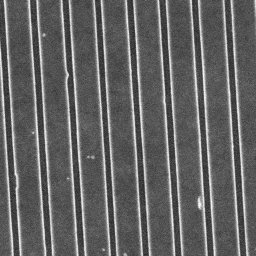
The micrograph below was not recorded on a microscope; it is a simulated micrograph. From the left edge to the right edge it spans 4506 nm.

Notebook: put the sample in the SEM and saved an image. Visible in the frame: parallel lines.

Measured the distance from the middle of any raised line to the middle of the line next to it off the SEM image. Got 568 nm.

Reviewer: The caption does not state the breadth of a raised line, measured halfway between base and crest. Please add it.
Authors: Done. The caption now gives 448 nanometers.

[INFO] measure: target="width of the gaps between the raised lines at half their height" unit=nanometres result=116